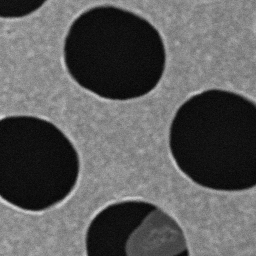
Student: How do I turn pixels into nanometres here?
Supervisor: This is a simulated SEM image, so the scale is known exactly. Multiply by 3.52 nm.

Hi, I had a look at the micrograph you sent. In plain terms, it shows holes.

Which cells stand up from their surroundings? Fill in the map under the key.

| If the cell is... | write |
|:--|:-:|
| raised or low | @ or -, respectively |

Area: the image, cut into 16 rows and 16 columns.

--@@@@-@@@@@@@@@
@@@@@----@@@@@@@
@@@@------@@@@@@
@@@@------@@@@@@
@@@@------@@@@@@
@@@@@-----@@@@@@
@@@@@@@@@@@-----
---@@@@@@@@-----
----@@@@@@@-----
-----@@@@@@-----
-----@@@@@@-----
-----@@@@@@@----
----@@@@@@@@@@@@
@@@@@@-----@@@@@
@@@@@------@@@@@
@@@@@-------@@@@